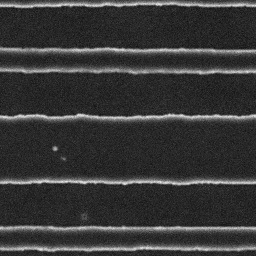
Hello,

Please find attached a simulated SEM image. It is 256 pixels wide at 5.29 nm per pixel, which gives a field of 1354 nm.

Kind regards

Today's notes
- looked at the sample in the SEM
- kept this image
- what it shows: lines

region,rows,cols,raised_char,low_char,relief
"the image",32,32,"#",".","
################################
................................
................................
................................
................................
................................
################################
################################
################################
................................
................................
................................
................................
................................
..####...###........###...##...#
################################
################################
################################
################################
################################
################################
################################
################################
................................
................................
................................
................................
................................
#######..#######################
################################
################################
................................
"